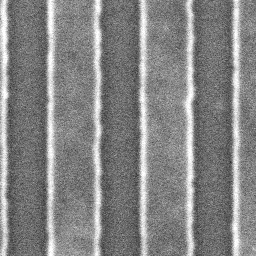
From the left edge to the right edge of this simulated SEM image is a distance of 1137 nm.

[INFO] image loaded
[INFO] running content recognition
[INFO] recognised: lines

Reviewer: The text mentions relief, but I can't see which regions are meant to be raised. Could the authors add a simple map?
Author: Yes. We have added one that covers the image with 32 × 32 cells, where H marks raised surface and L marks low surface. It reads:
HLLLLLHHHHHHLLLLLLHHHHHHLLLLLHHH
HLLLLLHHHHHHLLLLLLHHHHHHLLLLLHHH
HLLLLLHHHHHHLLLLLLHHHHHHLLLLLHHH
HLLLLLHHHHHHLLLLLLHHHHHHLLLLLHHH
HLLLLLHHHHHHLLLLLLHHHHHHLLLLLHHH
HLLLLLHHHHHHLLLLLLHHHHHHLLLLLHHH
HLLLLLHHHHHHLLLLLLHHHHHHLLLLLHHH
HLLLLLHHHHHHLLLLLLHHHHHHLLLLLHHH
HLLLLLHHHHHHLLLLLLHHHHHHLLLLLHHH
HLLLLLHHHHHHHLLLLLHHHHHHLLLLLHHH
HLLLLLHHHHHHLLLLLLHHHHHHLLLLLHHH
HLLLLLHHHHHHLLLLLLHHHHHHLLLLLHHH
HLLLLLHHHHHHLLLLLLHHHHHHLLLLLHHH
HLLLLLHHHHHHLLLLLLHHHHHHLLLLLHHH
HLLLLLHHHHHHLLLLLLHHHHHHLLLLLHHH
HLLLLLHHHHHHLLLLLLHHHHHHLLLLLHHH
HLLLLLHHHHHHLLLLLLHHHHHHLLLLLHHH
HLLLLLHHHHHHLLLLLLHHHHHHLLLLLHHH
HLLLLLHHHHHHLLLLLLHHHHHHLLLLLHHH
HLLLLLHHHHHHLLLLLLHHHHHHLLLLLHHH
HLLLLLHHHHHHLLLLLLHHHHHHLLLLLHHH
HLLLLLHHHHHHLLLLLLHHHHHHLLLLLHHH
HLLLLLHHHHHHLLLLLLHHHHHHLLLLLHHH
HLLLLLHHHHHHLLLLLLHHHHHHLLLLLHHH
HLLLLLHHHHHHLLLLLLHHHHHHLLLLLHHH
HLLLLLHHHHHHLLLLLLHHHHHHLLLLLHHH
HLLLLLHHHHHHLLLLLLHHHHHHLLLLLHHH
HLLLLLHHHHHHLLLLLLHHHHHHLLLLLHHH
HLLLLLHHHHHHLLLLLLHHHHHHLLLLLHHH
HLLLLLHHHHHHLLLLLLHHHHHHLLLLLHHH
HLLLLLHHHHHHLLLLLLHHHHHHLLLLLHHH
HLLLLLHHHHHHLLLLLLHHHHHHLLLLLHHH